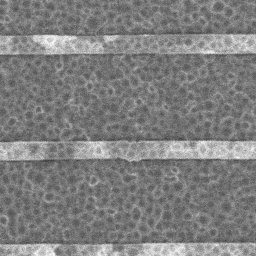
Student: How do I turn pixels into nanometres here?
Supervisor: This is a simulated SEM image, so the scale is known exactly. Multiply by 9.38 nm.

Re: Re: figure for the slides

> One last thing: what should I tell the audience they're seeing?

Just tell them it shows one or a few lines or trenches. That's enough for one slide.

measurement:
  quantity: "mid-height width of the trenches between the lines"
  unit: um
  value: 0.815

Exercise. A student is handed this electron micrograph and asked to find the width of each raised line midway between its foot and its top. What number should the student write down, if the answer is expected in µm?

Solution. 0.161